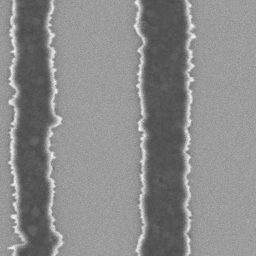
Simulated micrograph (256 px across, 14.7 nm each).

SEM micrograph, one or a few lines or trenches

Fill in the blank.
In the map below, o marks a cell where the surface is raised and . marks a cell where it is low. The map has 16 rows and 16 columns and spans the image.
.oo......ooo....
.oo.....oooo....
.oo......ooo....
.oo......ooo....
.oo......ooo....
.oo......ooo....
.oo......ooo....
.ooo.....ooo....
.oo......ooo....
.oo......ooo....
.oo......ooo....
.oo......ooo....
.oo......ooo....
.oo......ooo....
.ooo.....ooo....
.ooo.....ooo....